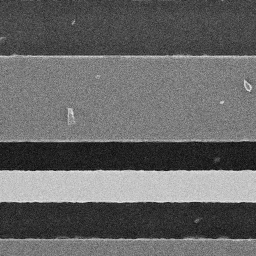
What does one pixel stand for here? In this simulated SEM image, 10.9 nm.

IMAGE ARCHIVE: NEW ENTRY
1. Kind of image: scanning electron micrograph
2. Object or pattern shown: lines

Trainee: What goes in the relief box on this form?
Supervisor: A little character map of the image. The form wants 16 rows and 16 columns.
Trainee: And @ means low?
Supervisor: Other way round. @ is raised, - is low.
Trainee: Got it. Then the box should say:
----------------
----------------
----------------
----------------
@@@@@@@@@@@@@@@@
@@@@@@@@@@@@@@@@
@@@@@@@@@@@@@@@@
@@@@@@@@@@@@@@@@
@@@@@@@@@@@@@@@@
----------------
----------------
@@@@@@@@@@@@@@@@
@@@@@@@@@@@@@@@@
----------------
----------------
@@@@@@@@@@@@@@@@